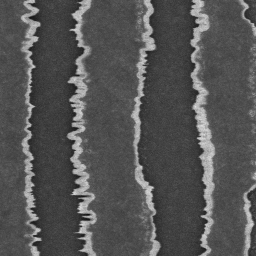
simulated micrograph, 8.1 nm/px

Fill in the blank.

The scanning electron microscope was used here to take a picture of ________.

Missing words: one or a few lines or trenches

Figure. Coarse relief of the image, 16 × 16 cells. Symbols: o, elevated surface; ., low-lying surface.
oo...oooo...ooo.
oo...oooo...oooo
oo...oooo...oooo
oo...oooo...oooo
oo...oooo...oooo
oo...oooo....ooo
oo...oooo...oooo
oo...oooo....ooo
oo...oooo....ooo
oo...oooo....ooo
oo...oooo....ooo
oo...oooo....ooo
oo...oooo....oo.
oo...ooooo...ooo
oo...ooooo...ooo
oo....oooo...oo.